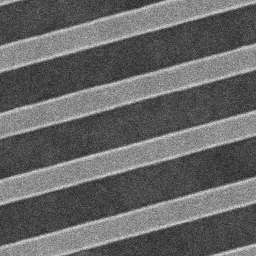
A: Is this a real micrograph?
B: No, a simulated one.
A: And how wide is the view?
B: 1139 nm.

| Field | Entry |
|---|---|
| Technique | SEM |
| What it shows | one or a few lines or trenches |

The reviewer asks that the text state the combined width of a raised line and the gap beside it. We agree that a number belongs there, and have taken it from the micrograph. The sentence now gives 286 nanometers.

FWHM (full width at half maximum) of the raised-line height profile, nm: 103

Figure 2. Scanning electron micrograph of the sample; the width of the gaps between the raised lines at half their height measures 185 nanometers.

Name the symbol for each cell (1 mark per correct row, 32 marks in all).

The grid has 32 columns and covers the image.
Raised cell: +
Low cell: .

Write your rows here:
...................++++++++++++.
................++++++++++++....
............++++++++++++........
.........+++++++++++............
.....+++++++++++................
.++++++++++++...................
+++++++++....................+++
+++++....................+++++++
++...................+++++++++++
..................+++++++++++...
..............+++++++++++.......
..........+++++++++++...........
.......++++++++++...............
...+++++++++++..................
++++++++++....................++
++++++....................++++++
+++....................+++++++++
...................++++++++++...
...............+++++++++++......
............++++++++++..........
........++++++++++..............
....+++++++++++.................
.++++++++++....................+
+++++++....................+++++
++++....................++++++++
....................+++++++++++.
................+++++++++++.....
.............+++++++++++........
.........+++++++++++............
.....+++++++++++................
..+++++++++++...................
+++++++++....................+++